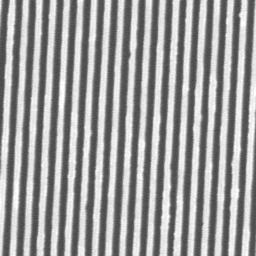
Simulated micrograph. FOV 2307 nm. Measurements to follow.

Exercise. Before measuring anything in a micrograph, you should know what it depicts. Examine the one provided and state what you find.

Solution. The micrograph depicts parallel lines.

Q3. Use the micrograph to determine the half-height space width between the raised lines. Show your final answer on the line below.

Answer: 68.6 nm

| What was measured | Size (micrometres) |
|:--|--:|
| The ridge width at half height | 0.0529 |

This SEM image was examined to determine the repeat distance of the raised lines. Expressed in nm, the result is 123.